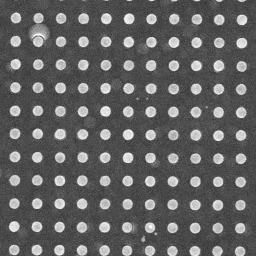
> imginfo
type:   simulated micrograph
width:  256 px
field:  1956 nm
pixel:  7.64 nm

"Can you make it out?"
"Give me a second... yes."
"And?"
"raised bodies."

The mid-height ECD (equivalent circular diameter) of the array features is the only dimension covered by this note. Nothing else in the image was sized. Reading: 58.5 nanometers